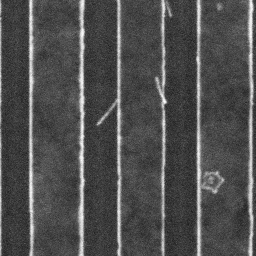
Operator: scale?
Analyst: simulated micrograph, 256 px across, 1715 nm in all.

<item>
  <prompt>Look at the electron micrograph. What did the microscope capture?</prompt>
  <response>lines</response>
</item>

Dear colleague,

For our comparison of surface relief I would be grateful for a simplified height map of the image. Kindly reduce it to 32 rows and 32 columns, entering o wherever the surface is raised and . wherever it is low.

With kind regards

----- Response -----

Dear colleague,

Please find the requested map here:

....oooooo.....ooooo.....oooooo.
....oooooo.....ooooo.....oooooo.
....oooooo.....ooooo.....oooooo.
....oooooo.....ooooo.....oooooo.
....oooooo.....ooooo.....oooooo.
....oooooo.....ooooo.....oooooo.
....oooooo.....oooooo....oooooo.
....oooooo.....ooooo.....oooooo.
....oooooo.....ooooo.....oooooo.
....oooooo.....ooooo.....oooooo.
....oooooo.....ooooo.....oooooo.
....oooooo.....ooooo.....oooooo.
....oooooo.....oooooo....oooooo.
....oooooo.....ooooo.....oooooo.
....oooooo.....oooooo....oooooo.
....oooooo.....oooooo....oooooo.
....oooooo.....oooooo....oooooo.
....oooooo.....oooooo....oooooo.
....oooooo.....ooooo.....oooooo.
....oooooo.....oooooo....oooooo.
....oooooo.....ooooo.....oooooo.
....oooooo.....ooooo.....oooooo.
....oooooo.....ooooo.....oooooo.
....oooooo.....ooooo.....oooooo.
....oooooo.....ooooo.....oooooo.
....oooooo.....ooooo.....oooooo.
....oooooo.....ooooo.....oooooo.
....oooooo.....ooooo.....oooooo.
....oooooo.....ooooo.....oooooo.
....oooooo.....ooooo.....oooooo.
....oooooo.....ooooo.....oooooo.
....oooooo.....ooooo.....oooooo.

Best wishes